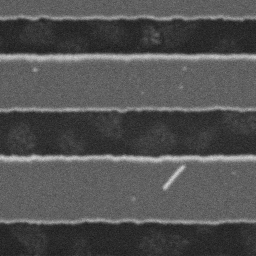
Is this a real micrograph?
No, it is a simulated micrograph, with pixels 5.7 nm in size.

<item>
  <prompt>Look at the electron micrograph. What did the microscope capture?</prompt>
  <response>lines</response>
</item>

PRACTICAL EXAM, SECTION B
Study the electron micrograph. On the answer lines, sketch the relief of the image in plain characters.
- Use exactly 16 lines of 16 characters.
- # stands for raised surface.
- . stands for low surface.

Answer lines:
################
................
................
################
################
################
################
................
................
................
################
################
################
################
................
................